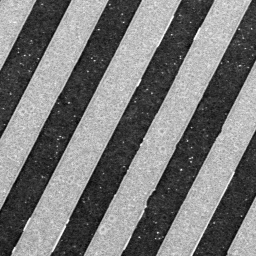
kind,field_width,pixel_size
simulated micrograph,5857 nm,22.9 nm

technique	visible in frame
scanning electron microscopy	one or a few lines or trenches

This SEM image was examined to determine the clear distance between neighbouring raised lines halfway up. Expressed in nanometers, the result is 717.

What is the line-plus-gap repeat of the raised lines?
1460 nm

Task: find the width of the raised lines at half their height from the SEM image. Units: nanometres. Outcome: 717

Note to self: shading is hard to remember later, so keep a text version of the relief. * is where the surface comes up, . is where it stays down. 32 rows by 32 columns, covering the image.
****.....****.....****.....****.
****....*****....*****....*****.
***.....****.....****.....****..
***....*****....*****....*****..
**.....****.....****.....****...
**....*****....*****....*****...
*.....****.....****.....****....
*....*****....*****....****.....
.....****.....****.....****.....
....*****....*****....****.....*
....****.....****.....****.....*
...*****....*****....****.....**
...****.....****.....****.....**
..****.....*****....****.....***
..****....*****.....****.....***
.****.....*****....****.....****
.****....*****.....****.....****
****.....*****....****.....****.
****....*****....*****.....****.
***.....*****....****.....****..
***....*****....*****.....****..
**.....****.....****.....****...
**....*****....*****....*****...
*.....****.....****.....****....
*....*****....*****....*****....
.....*****....****.....****.....
....*****....*****....*****....*
....*****....****.....****.....*
...*****....*****....*****....**
...****.....****.....****.....**
..*****....*****....*****....***
..****.....****.....****.....***